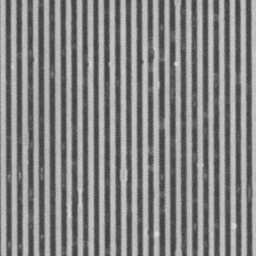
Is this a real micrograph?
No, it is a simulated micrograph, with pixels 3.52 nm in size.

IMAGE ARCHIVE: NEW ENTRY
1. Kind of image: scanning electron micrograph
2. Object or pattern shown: parallel lines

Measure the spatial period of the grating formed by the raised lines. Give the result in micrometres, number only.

0.0385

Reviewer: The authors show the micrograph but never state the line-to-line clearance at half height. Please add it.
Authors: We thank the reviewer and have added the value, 22.5 nm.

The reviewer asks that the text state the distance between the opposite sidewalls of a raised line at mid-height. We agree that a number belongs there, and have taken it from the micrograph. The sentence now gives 4.52 pixels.